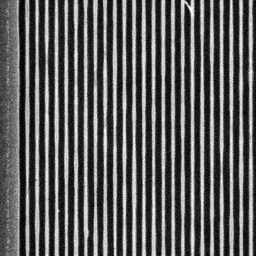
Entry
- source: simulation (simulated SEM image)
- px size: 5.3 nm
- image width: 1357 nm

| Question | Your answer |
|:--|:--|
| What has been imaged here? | parallel lines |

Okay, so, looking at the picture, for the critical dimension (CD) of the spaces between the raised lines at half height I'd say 37.8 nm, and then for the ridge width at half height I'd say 13.9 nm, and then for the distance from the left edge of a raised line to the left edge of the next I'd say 51.5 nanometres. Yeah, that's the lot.